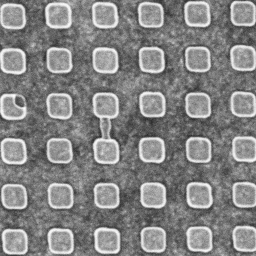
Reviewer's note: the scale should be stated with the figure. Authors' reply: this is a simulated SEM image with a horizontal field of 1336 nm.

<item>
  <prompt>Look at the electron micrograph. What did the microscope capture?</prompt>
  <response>a regular array of raised bodies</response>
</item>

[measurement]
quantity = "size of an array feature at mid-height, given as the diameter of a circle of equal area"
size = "135 nm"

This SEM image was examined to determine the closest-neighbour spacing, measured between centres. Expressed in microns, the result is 0.234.